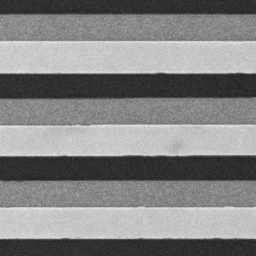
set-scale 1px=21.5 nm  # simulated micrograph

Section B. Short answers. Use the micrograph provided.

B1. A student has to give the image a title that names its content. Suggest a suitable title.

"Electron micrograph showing lines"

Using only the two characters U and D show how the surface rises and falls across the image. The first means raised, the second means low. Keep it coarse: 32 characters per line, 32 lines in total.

DDDDDDDDDDDDDDDDDDDDDDDDDDDDDDDD
DDDDDDDDDDDDDDDDDDDDDDDDDDDDDDDD
UUUUUUUUUUUUUUUUUUUUUUUUUUUUUUUU
UUUUUUUUUUUUUUUUUUUUUUUUUUUUUUUU
UUUUUUUUUUUUUUUUUUUUUUUUUUUUUUUU
UUUUUUUUUUUUUUUUUUUUUUUUUUUUUUUU
UUUUUUUUUUUUUUUUUUUUUUUUUUUUUUUU
UUUUUUUUUUUUUUUUUUUUUUUUUUUUUUUU
UUUUUUUUUUUUUUUUUUUUUUUUUUUUUUUU
DDDDDDDDDDDDDDDDDDDDDDDDDDDDDDDD
DDDDDDDDDDDDDDDDDDDDDDDDDDDDDDDD
DDDDDDDDDDDDDDDDDDDDDDDDDDDDDDDD
UUUUUUUUUUUUUUUUUUUUUUUUUUUUUUUU
UUUUUUUUUUUUUUUUUUUUUUUUUUUUUUUU
UUUUUUUUUUUUUUUUUUUUUUUUUUUUUUUU
UUUUUUUUUUUUUUUUUUUUUUUUUUUUUUUU
UUUUUUUUUUUUUUUUUUUUUUUUUUUUUUUU
UUUUUUUUUUUUUUUUUUUUUUUUUUUUUUUU
UUUUUUUUUUUUUUUUUUUUUUUUUUUUUUUU
DDDDDDDDDDDDDDDDDDDDDDDDDDDDDDDD
DDDDDDDDDDDDDDDDDDDDDDDDDDDDDDDD
DDDDDDDDDDDDDDDDDDDDDDDDDDDDDDDD
DDDDDDDDDDDDDDDDDDDDDDDDDDDDDDDD
UUUUUUUUUUUUUUUUUUUUUUUUUUUUUUUU
UUUUUUUUUUUUUUUUUUUUUUUUUUUUUUUU
UUUUUUUUUUUUUUUUUUUUUUUUUUUUUUUU
UUUUUUUUUUUUUUUUUUUUUUUUUUUUUUUU
UUUUUUUUUUUUUUUUUUUUUUUUUUUUUUUU
UUUUUUUUUUUUUUUUUUUUUUUUUUUUUUUU
UUUUUUUUUUUUUUUUUUUUUUUUUUUUUUUU
DDDDDDDDDDDDDDDDDDDDDDDDDDDDDDDD
DDDDDDDDDDDDDDDDDDDDDDDDDDDDDDDD